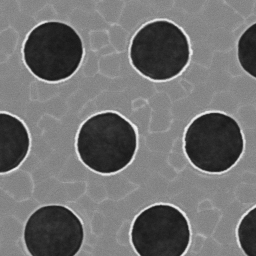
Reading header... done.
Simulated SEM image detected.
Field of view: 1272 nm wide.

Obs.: holes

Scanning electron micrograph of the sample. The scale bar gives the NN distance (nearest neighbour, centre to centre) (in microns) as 0.528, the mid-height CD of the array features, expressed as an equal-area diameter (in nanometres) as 290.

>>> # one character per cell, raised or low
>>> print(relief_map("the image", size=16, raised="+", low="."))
++++++++++++++++
+++.+++++..+++++
++...+++....+++.
++...+++....+++.
++...++++..+++++
++++++++++++++++
++++++++++++++++
.+++++..++++...+
..+++...++++...+
..+++...++++...+
.+++++..+++++.++
++++++++++++++++
++++++++++++++++
++...++++..++++.
++...+++....+++.
++...+++....+++.